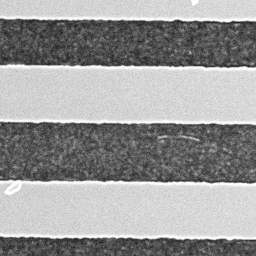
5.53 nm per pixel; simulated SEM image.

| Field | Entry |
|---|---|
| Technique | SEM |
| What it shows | lines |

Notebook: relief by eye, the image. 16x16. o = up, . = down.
oooooooooooooooo
................
................
................
oooooooooooooooo
oooooooooooooooo
oooooooooooooooo
oooooooooooooooo
................
................
................
oooooooooooooooo
oooooooooooooooo
oooooooooooooooo
oooooooooooooooo
................